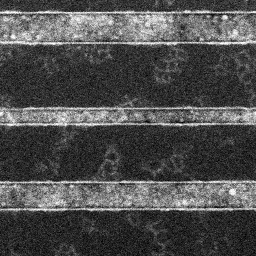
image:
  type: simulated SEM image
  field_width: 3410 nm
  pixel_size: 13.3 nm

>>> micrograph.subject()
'one or a few lines or trenches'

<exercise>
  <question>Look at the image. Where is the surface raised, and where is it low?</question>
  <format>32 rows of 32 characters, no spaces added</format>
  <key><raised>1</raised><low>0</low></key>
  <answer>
11111111111111111111111111111111
11111110011000000011111110111111
00000000000000000000000000000000
00000000000000000000000000000000
00000000000000000000000000000000
11111111111111111111111111111111
11111111111111111111111111111111
11111111111111111111111111111111
11111111111111111111111111111111
11111111111111111111111111111111
11111111111111111111111111111111
11111111111111111111111111111111
11111111111111111111111111111111
11111111111111111111111111111111
00000000000000000000000000000000
00000000000000000000000000000000
11111111111111111111111111111111
11111111111111111111111111111111
11111111111111111111111111111111
11111111111111111111111111111111
11111111111111111111011111111111
11111111111111111111111111111111
11111111111111111111111111111111
00000000000000000000000000000000
00000000000000000000000000000000
00000000000000000000000000000000
11111111111111111111111111111111
11111111111111111111111111111111
11111111111111111111111111111111
11111111111111111111111111111111
11111111111111111111111111111111
11111111111111111111111111111111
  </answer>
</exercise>